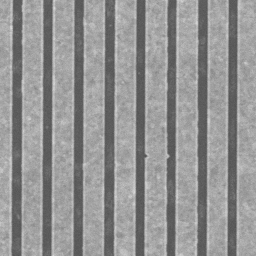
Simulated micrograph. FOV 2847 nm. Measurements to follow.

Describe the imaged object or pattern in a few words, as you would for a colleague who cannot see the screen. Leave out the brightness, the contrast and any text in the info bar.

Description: parallel lines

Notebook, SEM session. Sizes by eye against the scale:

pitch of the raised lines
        344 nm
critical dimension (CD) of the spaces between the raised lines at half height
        11.4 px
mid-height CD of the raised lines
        224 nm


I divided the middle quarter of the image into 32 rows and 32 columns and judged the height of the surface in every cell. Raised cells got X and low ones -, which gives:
XX---XXXXX---XXXXX---XXXX---XXXX
XX---XXXXX---XXXXX---XXXX---XXXX
XX---XXXXX---XXXXX---XXXX---XXXX
XX---XXXXX---XXXXX---XXXX---XXXX
XX---XXXXX---XXXXX---XXXX---XXXX
XX---XXXXX---XXXXX---XXXX---XXXX
XX---XXXXX---XXXXX---XXXX---XXXX
XX---XXXXX---XXXXX---XXXX---XXXX
XX---XXXXX---XXXXX---XXXX---XXXX
XX---XXXXX---XXXXX---XXXX---XXXX
XX---XXXXX---XXXXX---XXXX---XXXX
XX---XXXXX---XXXXX---XXXX---XXXX
XX---XXXXX---XXXXX---XXXX---XXXX
XX---XXXXX---XXXXX---XXXX---XXXX
XX---XXXXX---XXXXX---XXXX---XXXX
XX---XXXXX---XXXXX---XXXX---XXXX
XX---XXXXX---XXXXX---XXXX---XXXX
XX---XXXXX---XXXXX---XXXX---XXXX
XX---XXXXX---XXXXX---XXXX---XXXX
XX---XXXXX---XXXXX---XXXX---XXXX
XX---XXXXX---XXXXX---XXXX---XXXX
XX---XXXXX---XXXXX---XXXX---XXXX
XX---XXXXX---XXXXX---XXXXX--XXXX
XX---XXXXX---XXXXX---XXXXX--XXXX
XX---XXXXX---XXXXX---XXXX---XXXX
XX---XXXXX---XXXXX---XXXX---XXXX
XX---XXXXX---XXXXX---XXXX---XXXX
XX---XXXXX---XXXXX---XXXX---XXXX
XX---XXXXX---XXXXX---XXXX---XXXX
XX---XXXXX---XXXXX--XXXXX---XXXX
XX---XXXXX---XXXXX--XXXXX---XXXX
XX---XXXXX---XXXXX--XXXXX---XXXX